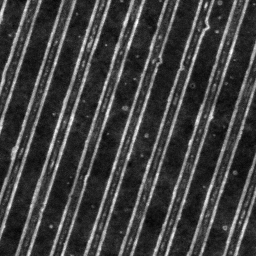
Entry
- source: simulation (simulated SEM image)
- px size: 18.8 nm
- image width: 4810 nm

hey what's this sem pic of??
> parallel lines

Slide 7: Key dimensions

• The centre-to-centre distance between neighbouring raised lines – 618 nanometres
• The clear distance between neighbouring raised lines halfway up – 0.19 µm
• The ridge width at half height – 0.432 micrometres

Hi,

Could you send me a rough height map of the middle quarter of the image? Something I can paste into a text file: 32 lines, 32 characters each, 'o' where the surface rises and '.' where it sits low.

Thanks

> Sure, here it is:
ooo...oooooo..oooooo...ooooooo..
ooo...oooooo..oooooo...oooooo..o
ooo..oooooo...oooooo...oooooo..o
oo...oooooo...oooooo..oooooo...o
oo...oooooo..oooooo...oooooo...o
oo..oooooo...oooooo...oooooo..oo
o...oooooo...oooooo..oooooo...oo
o...oooooo..oooooo...oooooo...oo
o...oooooo..oooooo...oooooo..ooo
o..oooooo...oooooo...ooooo...ooo
...oooooo..oooooo...oooooo...ooo
...oooooo..oooooo...oooooo..oooo
..oooooo...oooooo..oooooo...oooo
..oooooo...ooooo...oooooo...oooo
..oooooo..oooooo...oooooo..ooooo
.oooooo...oooooo..oooooo...ooooo
.oooooo..oooooo...oooooo...ooooo
.oooooo..oooooo...oooooo...ooooo
oooooo...oooooo..oooooo...oooooo
oooooo...ooooo...oooooo...oooooo
oooooo..oooooo...oooooo...ooooo.
ooooo...oooooo..oooooo...oooooo.
ooooo...oooooo..oooooo...oooooo.
ooooo..oooooo...oooooo...ooooo..
oooo...oooooo...oooooo..oooooo..
oooo...oooooo..oooooo...oooooo..
oooo..oooooo...oooooo...oooooo..
ooo...oooooo...oooooo..oooooo...
ooo..ooooooo..oooooo...oooooo...
ooo..oooooo...oooooo...oooooo..o
oo...oooooo...oooooo..oooooo...o
oo...oooooo...ooooo...oooooo...o